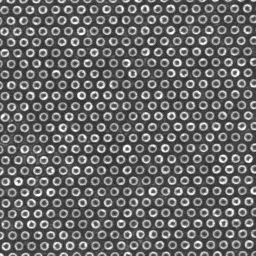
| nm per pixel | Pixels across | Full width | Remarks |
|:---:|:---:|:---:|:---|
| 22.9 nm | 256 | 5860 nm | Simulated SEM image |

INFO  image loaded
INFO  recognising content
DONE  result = a regular array of raised bodies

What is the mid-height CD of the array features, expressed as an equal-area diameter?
179 nm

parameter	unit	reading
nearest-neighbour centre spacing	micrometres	0.281